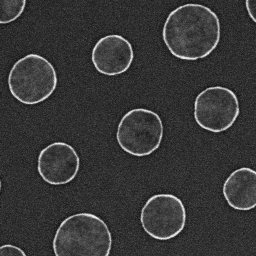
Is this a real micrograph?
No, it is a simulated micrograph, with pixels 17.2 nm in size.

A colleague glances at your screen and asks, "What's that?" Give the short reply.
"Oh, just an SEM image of raised bodies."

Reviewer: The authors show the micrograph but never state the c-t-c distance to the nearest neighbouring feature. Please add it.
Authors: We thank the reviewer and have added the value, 1400 nanometres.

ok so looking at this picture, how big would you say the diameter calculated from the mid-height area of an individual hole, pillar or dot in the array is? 750 nm